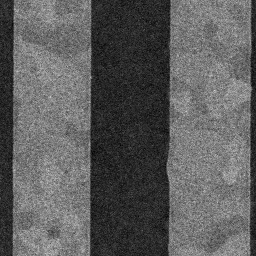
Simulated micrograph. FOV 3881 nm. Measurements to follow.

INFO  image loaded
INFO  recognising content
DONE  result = one or a few lines or trenches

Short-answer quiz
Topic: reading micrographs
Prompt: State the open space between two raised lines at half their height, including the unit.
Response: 1180 nm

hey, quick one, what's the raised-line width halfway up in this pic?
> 1150 nanometers